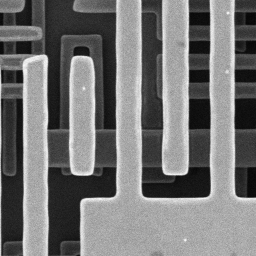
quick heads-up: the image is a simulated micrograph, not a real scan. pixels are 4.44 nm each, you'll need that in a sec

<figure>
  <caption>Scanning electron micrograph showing wiring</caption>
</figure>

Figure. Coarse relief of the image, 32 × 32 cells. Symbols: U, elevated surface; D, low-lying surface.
DDDDDDDDDDDDDDDUUUDDUUUUDDUUUDDD
DDDDDDDDDDDDDDDUUUDDUUUUDDUUUDDD
DDDDDDDDDDDDDDDUUUDDUUUUDDUUUDDD
DDDDDDDDDDDDDDDUUUDDUUUUDDUUUDDD
DDDDDDDDDDDDDDDUUUDDUUUUDDUUUDDD
DDDDDDDDDDDDDDDUUUDDUUUUDDUUUDDD
DDDDDDDDDDDDDDDUUUDDUUUUDDUUUDDD
DDDUUUDDDUUDDDDUUUDDUUUDDDUUUDDD
DDDUUUDDDUUUDDDUUUDDUUUUDDUUUDDD
DDDUUUDDDUUUDDDUUUDDUUUUDDUUUDDD
DDDUUUDDDUUUDDDUUUDDUUUUDDUUUDDD
DDDUUUDDDUUUDDDUUUDDUUUDDDUUUDDD
DDDUUUDDDUUUDDDUUUDDUUUUDDUUUDDD
DDDUUUDDDUUUDDDUUUDDUUUUDDUUUDDD
DDDUUUDDDUUUDDDUUUDDUUUUDDUUUDDD
DDDUUUDDDUUUDDDUUUDDUUUUDDUUUDDD
DDDUUUDDDUUUDDDUUUDDUUUUDDUUUDDD
DDDUUUDDDUUUDDDUUUDUUUUUDDUUUDDD
DDDUUUDDDUUUDDDUUUDDUUUUDDUUUDDD
DDDUUUDDDUUUDDDUUUDDUUUUDDUUUDDD
DDDUUUDDDUUUDDDUUUDDUUUUDDUUUDDD
DDDUUUDDDUUUDDDUUUDDUUUDDDUUUDDD
DDDUUUDDDDDDDDDUUUDDDDDDDDUUUDDD
DDDUUUDDDDDDDDDUUUDDDDDDDDUUUDDD
DDDUUUDDDDDDDDUUUUDDDDDDDDUUUUDD
DDDUUUDDDDUUUUUUUUUUUUUUUUUUUUUU
DDDUUUDDDDUUUUUUUUUUUUUUUUUUUUUU
DDDUUUDDDDUUUUUUUUUUUUUUUUUUUUUU
DDDUUUDDDDUUUUUUUUUUUUUUUUUUUUUU
DDDUUUDDDDUUUUUUUUUUUUUUUUUUUUUU
DDDUUUDDDDUUUUUUUUUUUUUUUUUUUUUU
DDDUUUDDDDUUUUUUUUUUUUUUUUUUUUUU